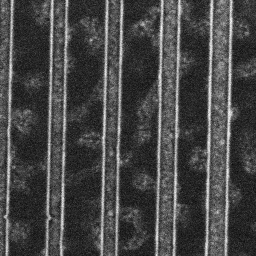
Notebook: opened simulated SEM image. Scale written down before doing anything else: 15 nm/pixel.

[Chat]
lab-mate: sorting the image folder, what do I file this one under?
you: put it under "parallel lines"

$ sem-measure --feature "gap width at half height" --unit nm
215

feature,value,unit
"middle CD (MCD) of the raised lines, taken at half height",0.631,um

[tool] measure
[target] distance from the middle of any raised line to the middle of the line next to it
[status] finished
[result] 54.4 px